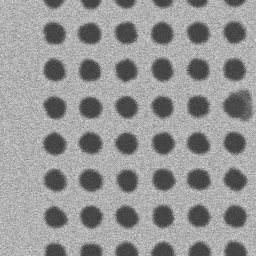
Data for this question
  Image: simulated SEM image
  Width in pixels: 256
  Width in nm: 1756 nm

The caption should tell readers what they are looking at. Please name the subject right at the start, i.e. a regular array of holes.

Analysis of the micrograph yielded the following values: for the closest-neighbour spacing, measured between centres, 35.7 pixels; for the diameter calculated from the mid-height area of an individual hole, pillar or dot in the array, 159 nanometres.